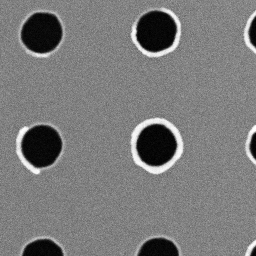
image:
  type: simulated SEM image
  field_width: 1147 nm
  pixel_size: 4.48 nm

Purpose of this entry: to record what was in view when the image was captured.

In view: holes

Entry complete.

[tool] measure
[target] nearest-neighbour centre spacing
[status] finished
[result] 508 nanometers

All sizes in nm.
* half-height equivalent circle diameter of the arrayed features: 184